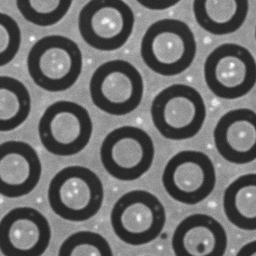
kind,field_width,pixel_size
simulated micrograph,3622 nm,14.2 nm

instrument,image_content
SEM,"a regular array of ring-shaped grooves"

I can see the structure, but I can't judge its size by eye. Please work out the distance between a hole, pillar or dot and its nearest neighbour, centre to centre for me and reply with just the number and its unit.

924 nanometers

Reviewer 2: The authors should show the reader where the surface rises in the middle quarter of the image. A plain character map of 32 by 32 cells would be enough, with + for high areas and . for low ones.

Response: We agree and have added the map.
+....++++........++++...........
+...++++..........++++........++
....+++.....+++....+++++.....+++
...++++....+++++....++++++++++++
...++++...+++++++...++++++++++++
..++++...++++++++...++++++.....+
++++++....+++++++...+++++.......
+++++++...+++++++...+++.........
+++++++....+++++...++++.....++..
..+++++.....++.....+++....++++++
....++++...........+++....++++++
......+++.........++++...+++++++
++....+++++.....++++++...+++++++
+++....+++++++++++++++...+++++++
++++...+++++++++++++++....++++++
++++...++++++++..++++++....+++..
++++...+++++........+++.........
++++...++++..........+++........
+++....+++............+++.......
++....++++....++++....++++++++++
......+++....++++++...++++++++++
.....++++...+++++++....+++++++++
...++++++...+++++++....+++++....
+++++++++...+++++++...+++++.....
+++++++++....++++++...++++......
+...++++++....+++.....+++....+++
.......+++...........++++...++++
........+++.........+++++...++++
.........++++......+++++....++++
+++++....++++++++++++++++...++++
++++++....+++++++++++++++...++++
++++++....+++++++..++++++.....++